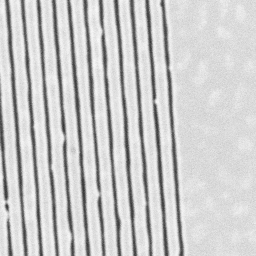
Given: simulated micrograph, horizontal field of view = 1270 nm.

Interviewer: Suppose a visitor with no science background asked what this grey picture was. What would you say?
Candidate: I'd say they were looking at parallel lines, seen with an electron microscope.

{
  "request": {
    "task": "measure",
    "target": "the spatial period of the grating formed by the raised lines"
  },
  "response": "0.077 microns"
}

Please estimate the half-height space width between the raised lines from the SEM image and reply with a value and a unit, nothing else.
22.3 nm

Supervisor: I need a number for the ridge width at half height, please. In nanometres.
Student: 53.2